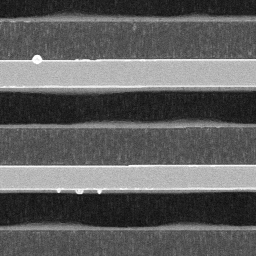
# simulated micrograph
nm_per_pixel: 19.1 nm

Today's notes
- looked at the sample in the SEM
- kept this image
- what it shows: lines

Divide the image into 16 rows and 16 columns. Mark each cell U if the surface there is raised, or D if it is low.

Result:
DDDDDDDDDDDDDDDD
UUUUUUUUUUUUUUUU
UUUUUUUUUUUUUUUU
UUUUUUUUUUUUUUUU
UUUUUUUUUUUUUUUU
DDDDDDDDDDDDDDDD
DDDDDDDDDDDDDDDD
DDDDDDDDDDDDDDDD
UUUUUUUUUUUUUUUU
UUUUUUUUUUUUUUUU
UUUUUUUUUUUUUUUU
UUUUUUUUUUUUUUUU
DDDDDDDDDDDDDDDD
DDDDDDDDDDDDDDDD
UUUUUUUUUUUUUUUU
UUUUUUUUUUUUUUUU